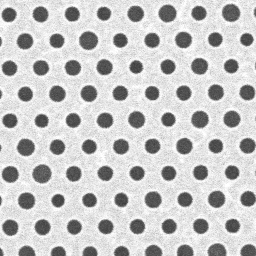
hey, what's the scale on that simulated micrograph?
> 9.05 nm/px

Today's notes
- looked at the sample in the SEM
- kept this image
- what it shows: a regular array of holes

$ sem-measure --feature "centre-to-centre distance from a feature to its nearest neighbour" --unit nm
277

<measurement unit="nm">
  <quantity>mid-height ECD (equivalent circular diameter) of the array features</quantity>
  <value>146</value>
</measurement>